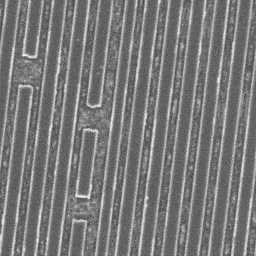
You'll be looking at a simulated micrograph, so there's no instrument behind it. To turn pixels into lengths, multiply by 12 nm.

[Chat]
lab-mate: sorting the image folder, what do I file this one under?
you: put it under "parallel lines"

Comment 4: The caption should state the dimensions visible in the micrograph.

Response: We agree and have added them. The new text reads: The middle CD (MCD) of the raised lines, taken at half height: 165 nanometers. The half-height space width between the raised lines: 107 nm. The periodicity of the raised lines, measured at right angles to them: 276 nm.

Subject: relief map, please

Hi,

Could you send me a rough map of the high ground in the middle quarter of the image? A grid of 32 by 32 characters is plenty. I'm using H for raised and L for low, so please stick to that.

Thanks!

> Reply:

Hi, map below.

LHHHLLLHHHLLLLHHLLHHHHLLHHHHLLHH
LHHHLLLHHHLLLLHHLLHHHHLLHHHLLLHH
LHHHLLLHHHLLLHHHLLHHHHLLHHHLLLHH
LHHHLLLHHHLLLHHHLLHHHHLLHHHLLLHH
LHHHLLHHHHLHLHHHLLHHHLLLHHHLLLHH
HHHHLLHHHHLLLHHHLLHHHLLLHHHLLLHH
HHHHLLHHHHLLLHHHLLHHHLLLHHHLLHHH
HHHHLLHHHLLLLHHHLLHHHLLHHHHLLHHH
HHHHLLHHHLLLLHHLLLHHHLLHHHHLLHHH
HHHLLLHHHLLLLHHLLLHHHLLHHHHLLHHH
HHHLLLHHHLLLHHHLLHHHHLLHHHLLLHHH
HHHLLLLLLLLLHHHLLHHHHLLHHHLHLHHH
HHHLLLLLLLLLHHHLLHHHHLLHHHLLLHHH
HHHLLLLLLLLLHHHLLHHHHLLHHHLLLHHH
HHHLLLLLLLLLHHHLLHHHLLLHHHLLLHHH
HHHLLLLLLLLLHHLLLHHHLLHHHHLLHHHH
HHLLLHHLLLLLHHLLLHHHLLHHHHLLHHHH
HHLLLHHHLLLLHHLLLHHHLLHHHHLLHHHL
HHLLLHHHLLLHHHLLHHHHLLHHHLLLHHHL
HHLLLHHHLLLHHHLLHHHHLLHHHLLLHHHL
HHLLLHHHLLLHHHLLHHHLLLHHHLLLHHHL
HHLLHHHHLLLHHHLLHHHLLLHHHLLLHHHL
HHLLHHHHLLLHHHLLHHHLLLHHHLLLHHHL
HHLLHHHHLLLHHLLLHHHLLLHHHLLHHHHL
HHLLHHHLLLLHHLLLHHHLLHHHHLLHHHHL
HHLLHHHLLLLHHLLLHHHLLHHHHLLHHHLL
HLLLHHHLLLLHHLLHHHHLLHHHLLLHHHLL
HLLLHHHLLLHHHLLHHHHLLHHHLLLHHHLL
HLLLHHHLLLHHHLLHHHHLLHHHLLLHHHLL
HLLHHHHLLLHHHLLHHHLLLHHHLLLHHHLL
HLLHHHHLLLHHHLLHHHLLLHHHLLLHHHLL
HLLHHHHLLLHHHLLHHHLLLHHHLLHHHHLL